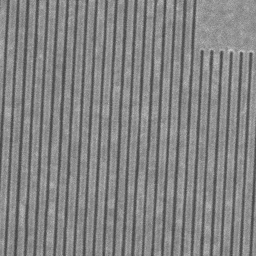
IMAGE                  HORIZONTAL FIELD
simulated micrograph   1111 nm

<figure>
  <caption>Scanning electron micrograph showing parallel lines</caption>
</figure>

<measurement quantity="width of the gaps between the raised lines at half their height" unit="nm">15.7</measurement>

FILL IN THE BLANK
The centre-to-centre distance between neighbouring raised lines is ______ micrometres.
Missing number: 0.0425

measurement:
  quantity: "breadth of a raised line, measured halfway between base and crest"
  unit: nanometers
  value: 27.7